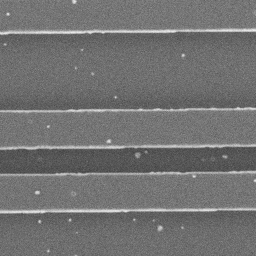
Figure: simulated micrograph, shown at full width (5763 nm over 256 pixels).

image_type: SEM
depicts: lines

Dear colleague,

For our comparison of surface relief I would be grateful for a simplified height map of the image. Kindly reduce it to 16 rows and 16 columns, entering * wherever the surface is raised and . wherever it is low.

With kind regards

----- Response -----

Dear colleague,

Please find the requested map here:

****************
****************
................
................
................
................
................
****************
****************
................
................
****************
****************
................
................
................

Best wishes